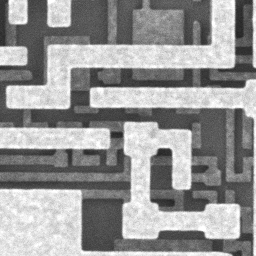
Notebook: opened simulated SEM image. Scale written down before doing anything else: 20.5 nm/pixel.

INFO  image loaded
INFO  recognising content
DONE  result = wiring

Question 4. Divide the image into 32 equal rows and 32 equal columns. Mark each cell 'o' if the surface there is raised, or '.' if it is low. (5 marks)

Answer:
.oo...ooo..................oo...
.oo...ooo..................oo...
.oo...ooo..................oo...
...........................oo...
...........................oo...
..........................ooo...
ooo...ooooooooooooooooooooooo...
ooo...ooooooooooooooooooooooo...
......ooo..................o....
......ooo.......................
......ooo......................o
.oooooooo..ooooooooooooooooooooo
.oooooooo..ooooooooooooooooooooo
..oooooo......................oo
...............................o
................oooo............
oooooooooooooo..oooooooo........
oooooooooooooo..oooooooo........
....o.oo.oooo...oooo.ooo........
................ooo...oo........
................ooo...oo........
................ooo...oo........
................ooo...oo........
................ooo...o.........
oooooooooo......ooo.............
oooooooooo......ooo.............
oooooooooo.....oooooo....ooooo..
oooooooooo.....ooooooooooooooo..
oooooooooo.....ooooooooooooooo..
oooooooooo......oooo......oooo..
oooooooooo......................
oooooooooooooooooo.oo...........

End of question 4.